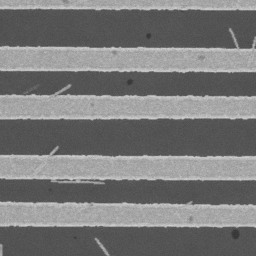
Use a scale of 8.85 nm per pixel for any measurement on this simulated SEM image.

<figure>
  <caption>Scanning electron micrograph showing lines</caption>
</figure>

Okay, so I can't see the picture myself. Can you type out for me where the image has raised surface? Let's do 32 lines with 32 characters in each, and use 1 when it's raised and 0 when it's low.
11111111111111111111111111111111
00000000000000000000000000000000
00000000000000000000000000000000
00000000000000000000000000000000
00000000000000000000000000000000
00000000000000000000000000000000
11111111111111111111111111111111
11111111111111111111111111111111
11111111111111111111111111111111
00000000000000000000000000000000
00000000000000000000000000000000
00000000000000000000000000000000
11111111111111111111111111111111
11111111111111111111111111111111
11111111111111111111111111111111
00000000000000000000000000000000
00000000000000000000000000000000
00000000000000000000000000000000
00000000000000000000000000000000
11100110000000000000000000000000
11111111111111111111111111111111
11111111111111111111111111111111
00000000000000000000000000000000
00000000000000000000000000000000
00000000000000000000000000000000
11111111111111111000000100000000
11111111111111111111111111111111
11111111111111111111111111111111
00000000000000000000000000000000
00000000000000000000000000000000
00000000000000000000000000000000
00000000000000000000000000000000